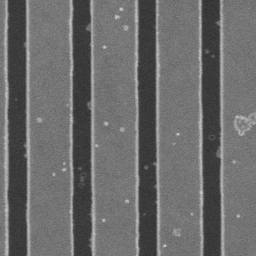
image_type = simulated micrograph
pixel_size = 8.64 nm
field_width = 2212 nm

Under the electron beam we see lines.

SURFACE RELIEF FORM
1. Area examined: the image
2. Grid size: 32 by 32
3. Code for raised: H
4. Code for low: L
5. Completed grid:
HLLHHHHHHLLHHHHHHLLLHHHHHLLLHHHH
HLLHHHHHHLLHHHHHHLLLHHHHHLLLHHHH
HLLHHHHHHLLHHHHHHLLLHHHHHLLLHHHH
HLLHHHHHHLLHHHHHHLLLHHHHHLLLHHHH
HLLHHHHHHLLHHHHHHLLLHHHHHLLLHHHH
HLLHHHHHHLLHHHHHHLLLHHHHHLLLHHHH
HLLHHHHHHLLHHHHHHLLLHHHHHLLLHHHH
HLLHHHHHHLLHHHHHHLLLHHHHHLLLHHHH
HLLHHHHHHLLHHHHHHLLLHHHHHLLLHHHH
HLLHHHHHHLLHHHHHHLLLHHHHHLLLHHHH
HLLHHHHHHLLHHHHHHLLLHHHHHLLLHHHH
HLLHHHHHHLLHHHHHHLLLHHHHHLLLHHHH
HLLHHHHHHLLHHHHHHLLLHHHHHLLLHHHH
HLLHHHHHHLLHHHHHHLLLHHHHHLLLHHHH
HLLHHHHHHLLHHHHHHLLLHHHHHLLLHHHH
HLLHHHHHHLLHHHHHHLLLHHHHHLLLHHHH
HLLHHHHHHLLHHHHHHLLLHHHHHLLLHHHH
HLLHHHHHHLLHHHHHHLLLHHHHHLLLHHHH
HLLHHHHHHLLHHHHHHLLLHHHHHLLLHHHH
HLLHHHHHHLLHHHHHHLLLHHHHHLLLHHHH
HLLHHHHHHLLHHHHHHLLLHHHHHLLLHHHH
HLLHHHHHHLLHHHHHHLLLHHHHHLLLHHHH
HLLHHHHHHLLLHHHHHLLLHHHHHLLLHHHH
HLLHHHHHHLLLHHHHHLLLHHHHHLLLHHHH
HLLHHHHHHLLLHHHHHLLLHHHHHLLLHHHH
HLLHHHHHHLLLHHHHHLLLHHHHHLLLHHHH
HLLHHHHHHLLLHHHHHLLLHHHHHLLLHHHH
HLLHHHHHHLLLHHHHHLLLHHHHHLLLHHHH
HLLHHHHHHLLLHHHHHLLLHHHHHLLLHHHH
HLLHHHHHHLLLHHHHHLLLHHHHHLLLHHHH
HLLHHHHHHLLLHHHHHLLLHHHHHLLLHHHH
HLLHHHHHHLLLHHHHHLLLHHHHHLLLHHHH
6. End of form